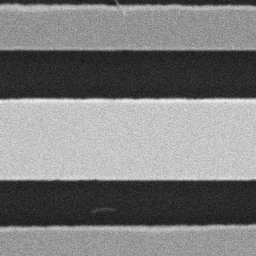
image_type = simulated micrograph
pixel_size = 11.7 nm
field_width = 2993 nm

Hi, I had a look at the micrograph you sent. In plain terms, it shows lines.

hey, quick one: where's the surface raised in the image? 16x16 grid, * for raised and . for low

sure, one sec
****************
****************
****************
................
................
................
****************
****************
****************
****************
****************
................
................
................
****************
****************